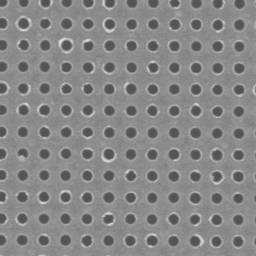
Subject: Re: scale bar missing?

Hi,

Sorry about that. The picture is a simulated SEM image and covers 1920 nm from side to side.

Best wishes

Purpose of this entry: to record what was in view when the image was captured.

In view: a regular array of holes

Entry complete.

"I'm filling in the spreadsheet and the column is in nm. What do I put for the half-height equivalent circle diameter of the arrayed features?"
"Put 74.3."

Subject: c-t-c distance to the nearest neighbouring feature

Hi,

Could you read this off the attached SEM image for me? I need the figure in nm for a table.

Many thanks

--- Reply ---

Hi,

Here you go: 159